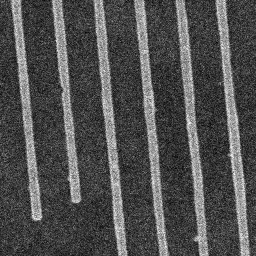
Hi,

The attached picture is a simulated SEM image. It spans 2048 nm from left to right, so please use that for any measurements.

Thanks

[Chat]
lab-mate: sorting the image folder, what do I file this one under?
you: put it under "parallel lines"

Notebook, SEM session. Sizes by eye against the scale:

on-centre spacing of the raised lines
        326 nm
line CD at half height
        63.2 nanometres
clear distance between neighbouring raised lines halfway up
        259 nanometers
